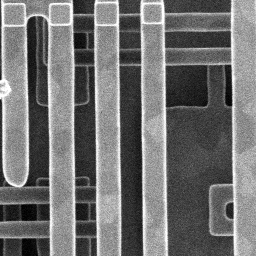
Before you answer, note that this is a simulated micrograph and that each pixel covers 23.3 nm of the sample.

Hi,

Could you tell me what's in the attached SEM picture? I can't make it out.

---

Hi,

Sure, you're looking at wiring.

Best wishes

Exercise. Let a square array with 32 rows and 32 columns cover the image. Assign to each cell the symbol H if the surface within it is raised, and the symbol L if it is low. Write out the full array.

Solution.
HHHHHHHHHLLLHHHLLLHHLLLLLLLLLHHH
HHHHHHHHHLLLHHHLLHHHHLLLLLLLLHHH
HHHHLHHHHHHHHHHHHHHHHHHHHHHHHHHH
HHHLLHHHHHHHHHHHHHHHHHHHHHHHHHHH
HHHLLHHHHLLLHHHLLLHHLLLLLLLLLHHH
HHHLLHHHHLLLHHHLLLHHLLLLLLLLLHHH
HHHLLHHHHHHHHHHHHHHHHHHHHHHHHHHH
HHHLLHHHHHHHHHHHHHHHHHHHHHHHHHHH
HHHLLLHHHLLLHHHLLLHHHLLLLLLLLHHH
HHHLLLHHHLLLHHHLLLHHHLLLLLLLLHHH
HHHLLLHHHLLLHHHLLLHHHLLLLLLLLHHH
HHHLLLHHHLLLHHHLLLHHHLLLLLLLLHHH
HHHLLLHHHLLLHHHLLLHHHLLLLLLLLHHH
HHHLLLHHHLLLHHHLLLHHHLLLLLLLLHHH
HHHLLLHHHLLLHHHLLLHHHLLLLLLLLHHH
HHHLLLHHHLLLHHHLLLHHHLLLLLLLLHHH
HHHLLLHHHLLLHHHLLLHHHLLLLLLLLHHH
HHHLLLHHHLLLHHHLLLHHHLLLLLLLLHHH
HHHLLLHHHLLLHHHLLLHHHLLLLLLLLHHH
HHHLLLHHHLLLHHHLLLHHHLLLLLLLLHHH
HHHLLLHHHLLLHHHLLLHHHLLLLLLLLHHH
HHHLLLHHHLLLHHHLLLHHHLLLLLLLLHHH
LHHLLLHHHLLLHHHLLLHHHLLLLLLLLHHH
HHHHHHHHHHHHHHHLLLHHHLLLLLHHHHHH
HHHHHHHHHHHHHHHLLLHHHLLLLLHHHHHH
HHLLLLHHHHLLHHHLLLHHHLLLLLHHHHHH
LLLLLLHHHLLLHHHLLLHHHLLLLLHHLHHH
LLLLLLHHHHLLHHHLLLHHHLLLLLHHHHHH
HHHHHHHHHHHHHHHLLLHHHLLLLLHHHHHH
HHHHHHHHHHHHHHHLLLHHHLLLLLLLLHHH
LLLLLLHHHLLLHHHLLLHHHLLLLLLLLHHH
LLLLLLHHHLLLHHHLLLHHHLLLLLLLLHHH